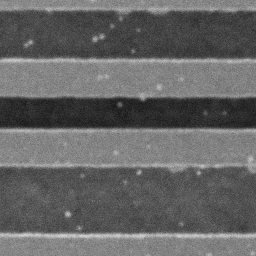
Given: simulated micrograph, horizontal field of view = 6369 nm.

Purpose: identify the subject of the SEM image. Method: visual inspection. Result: lines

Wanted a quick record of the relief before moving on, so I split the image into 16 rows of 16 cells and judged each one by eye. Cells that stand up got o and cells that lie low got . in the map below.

oooooooooooooooo
................
................
................
oooooooooooooooo
oooooooooooooooo
................
................
oooooooooooooooo
oooooooooooooooo
................
................
................
................
................
oooooooooooooooo